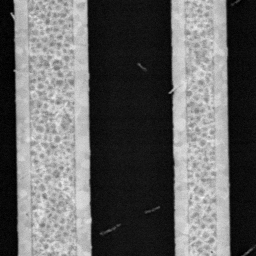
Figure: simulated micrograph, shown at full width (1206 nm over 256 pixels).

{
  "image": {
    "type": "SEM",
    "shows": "one or a few lines or trenches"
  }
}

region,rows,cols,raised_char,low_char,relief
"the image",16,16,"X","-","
-XXXX------XXX--
-XXXX------XXX--
-XXXX------XXX--
-XXXX------XXX--
-XXXX------XXX--
-XXXX------XXX--
-XXXX------XXX--
-XXXX------XXX--
--XXX------XXX--
--XXX------XXX--
--XXX------XXX--
--XXX------XXX--
--XXX------XXX--
--XXX------XXX--
--XXX------XXX--
--XXX------XXX--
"